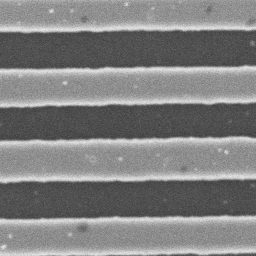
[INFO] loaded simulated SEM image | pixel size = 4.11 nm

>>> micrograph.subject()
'lines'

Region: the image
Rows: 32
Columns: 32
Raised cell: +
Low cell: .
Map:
++++++++++++++++++++++++++++++++
++++++++++++++++++++++++++++++++
++++++++++++++++++++++++++++++++
++++++++++++++++++++++++++++++++
................................
................................
................................
................................
.................+.++++.++++++++
++++++++++++++++++++++++++++++++
++++++++++++++++++++++++++++++++
++++++++++++++++++++++++++++++++
++++++++++++++++++++++++++++++++
................................
................................
................................
................................
...........++.++++++++++++++++++
++++++++++++++++++++++++++++++++
++++++++++++++++++++++++++++++++
++++++++++++++++++++++++++++++++
++++++++++++++++++++++++++++++++
++++++++++++++++++..............
................................
................................
................................
................................
++++++++++++++++++++++++++++++++
++++++++++++++++++++++++++++++++
++++++++++++++++++++++++++++++++
++++++++++++++++++++++++++++++++
++++++++++++++++++++++++++++++++